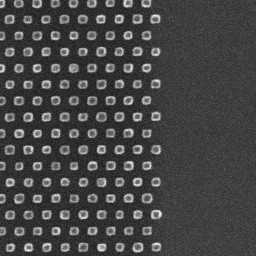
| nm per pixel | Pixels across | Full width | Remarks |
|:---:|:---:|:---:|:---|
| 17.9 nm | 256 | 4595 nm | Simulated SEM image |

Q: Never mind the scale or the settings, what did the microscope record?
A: a regular array of raised bodies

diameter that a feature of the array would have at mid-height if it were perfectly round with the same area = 158 nanometers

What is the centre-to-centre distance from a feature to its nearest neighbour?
0.324 micrometres